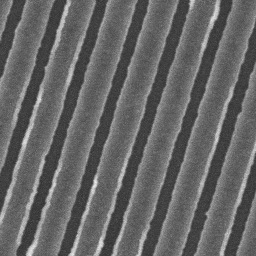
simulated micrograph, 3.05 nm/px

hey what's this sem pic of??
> parallel lines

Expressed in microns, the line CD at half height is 0.0824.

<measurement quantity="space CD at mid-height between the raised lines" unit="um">0.0386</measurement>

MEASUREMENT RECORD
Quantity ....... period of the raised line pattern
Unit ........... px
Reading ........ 39.7